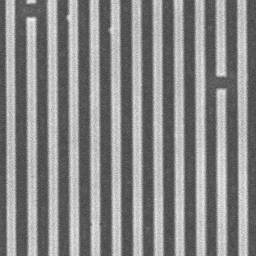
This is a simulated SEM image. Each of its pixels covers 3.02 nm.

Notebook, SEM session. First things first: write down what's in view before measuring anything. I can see parallel lines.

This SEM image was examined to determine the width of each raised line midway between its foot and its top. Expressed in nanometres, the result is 25.3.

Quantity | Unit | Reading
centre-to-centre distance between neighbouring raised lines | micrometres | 0.0637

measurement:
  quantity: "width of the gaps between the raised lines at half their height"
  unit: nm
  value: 39.7